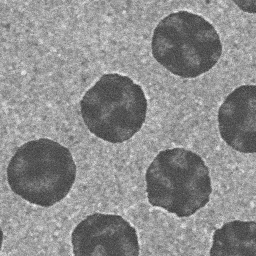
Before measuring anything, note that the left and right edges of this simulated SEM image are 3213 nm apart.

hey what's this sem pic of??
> holes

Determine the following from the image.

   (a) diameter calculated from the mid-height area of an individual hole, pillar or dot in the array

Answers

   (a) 0.844 µm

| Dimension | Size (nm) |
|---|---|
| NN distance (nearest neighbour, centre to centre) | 1210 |